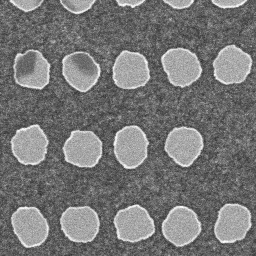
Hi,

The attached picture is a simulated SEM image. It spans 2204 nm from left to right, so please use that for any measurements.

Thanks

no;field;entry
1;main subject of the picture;a regular array of raised bodies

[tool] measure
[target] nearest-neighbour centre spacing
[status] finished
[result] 50.1 pixels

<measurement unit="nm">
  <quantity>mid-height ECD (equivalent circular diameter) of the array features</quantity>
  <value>324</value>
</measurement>